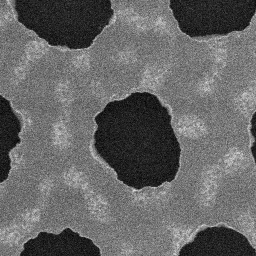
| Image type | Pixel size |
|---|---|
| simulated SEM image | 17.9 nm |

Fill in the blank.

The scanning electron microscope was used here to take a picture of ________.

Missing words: holes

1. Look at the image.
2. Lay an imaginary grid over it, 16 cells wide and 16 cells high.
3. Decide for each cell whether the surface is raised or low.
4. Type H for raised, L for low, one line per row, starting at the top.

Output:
HLLLLLLHHHHLLLLL
HLLLLLLHHHHLLLLL
HHHLLLHHHHHHLHHH
HHHHHHHHHHHHHHHH
HHHHHHHHHHHHHHHH
HHHHHHHHHHHHHHHH
LHHHHHHLLLHHHHHH
LHHHHHLLLLLHHHHH
LHHHHHLLLLLHHHHH
LHHHHHLLLLLHHHHH
LHHHHHHLLLLHHHHH
HHHHHHHHLLHHHHHH
HHHHHHHHHHHHHHHH
HHHHHHHHHHHHHHHH
HHHHLHHHHHHHLLLH
HLLLLLHHHHHLLLLL